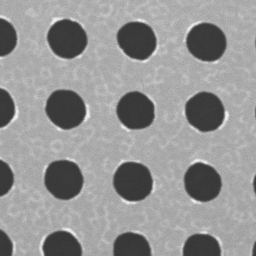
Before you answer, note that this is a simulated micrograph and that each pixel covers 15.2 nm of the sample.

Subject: a regular array of holes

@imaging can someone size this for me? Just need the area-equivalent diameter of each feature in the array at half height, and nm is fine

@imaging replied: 606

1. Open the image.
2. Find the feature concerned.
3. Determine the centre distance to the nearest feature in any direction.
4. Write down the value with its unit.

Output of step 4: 1050 nm